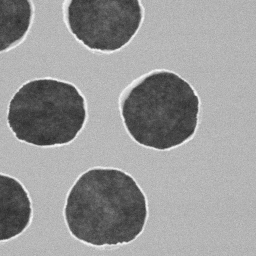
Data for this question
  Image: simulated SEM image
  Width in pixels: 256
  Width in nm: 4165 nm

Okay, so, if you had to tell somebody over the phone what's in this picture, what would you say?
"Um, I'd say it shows holes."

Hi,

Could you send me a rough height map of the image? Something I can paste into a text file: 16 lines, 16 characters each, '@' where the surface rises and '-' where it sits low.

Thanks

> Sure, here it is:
--@@-----@@@@@@@
--@@-----@@@@@@@
-@@@@---@@@@@@@@
@@@@@@@@@@@@@@@@
@@@@@@@@@@-@@@@@
@----@@@----@@@@
@----@@@----@@@@
@----@@@----@@@@
@----@@@----@@@@
@@@@@@@@@@@@@@@@
@@@@@@@@@@@@@@@@
-@@@@----@@@@@@@
--@@-----@@@@@@@
--@@-----@@@@@@@
-@@@@----@@@@@@@
@@@@@@@@@@@@@@@@